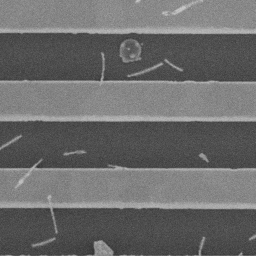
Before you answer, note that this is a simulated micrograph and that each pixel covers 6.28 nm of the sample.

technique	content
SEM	lines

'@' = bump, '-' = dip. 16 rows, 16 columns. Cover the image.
@@@@@@@@@@@@@@@@
@@@@@@@@@@@@@@@@
----------------
----------------
----------------
@@@@@@@@@@@@@@@@
@@@@@@@@@@@@@@@@
----------------
----------------
----------------
-@@----@--------
@@@@@@@@@@@@@@@@
@@@@@@@@@@@@@@@@
----------------
----------------
------@---------